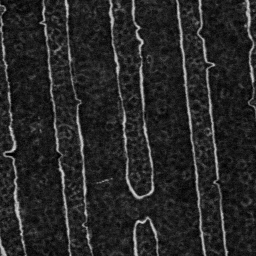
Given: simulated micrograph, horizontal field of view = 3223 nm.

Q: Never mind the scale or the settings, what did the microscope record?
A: one or a few lines or trenches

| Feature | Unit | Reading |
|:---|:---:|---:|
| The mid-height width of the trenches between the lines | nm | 551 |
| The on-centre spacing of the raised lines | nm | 841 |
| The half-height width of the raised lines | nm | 276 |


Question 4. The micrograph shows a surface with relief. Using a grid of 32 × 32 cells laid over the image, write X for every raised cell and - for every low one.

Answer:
-----XXX------XXX-----XXX------X
X----XXX------XXX-----XXX------X
-----XXX------XXX-----XXX------X
------XX------XXX------XX------X
------XXX-----XXX------XX------X
------XXX-----XXXX-----XX-------
------XXX-----XXXX-----XXX-----X
X-----XXX------XXX-----XXX-----X
X-----XXX------XXX-----XXX-----X
X-----XXX------XXX-----XXX-----X
X-----XXX------XXX-----XXX------
X-----XXX------XXX-----XXX------
X------XXX-----XXX-----XXX-----X
X------XXX-----XXX-----XXX------
X------XXX------XX------XX------
X------XXX------XX------XXX-----
X------XXX-----XXX------XXX-----
XX-----XXX------XX------XXX-----
XX-----XXX------XXX-----XXX-----
X-------XX------XXX-----XXX-----
XX-----XXX------XXX-----XXX-----
XX------XX------XXX------XX-----
XX------XXX-----XXX------XX-----
XX------XXX-----XXX------XX-----
XX------XXX------X-------XXX----
XX------XXX--------------XXX----
XX------XXX--------------XXX----
XXX-----XXX--------------XXX----
XXX-----XXX------XX------XXX----
XXX------XX------XXX-----XXX----
XXX------XX------XXX-----XXX----
XXX------XX------XXX------XX----